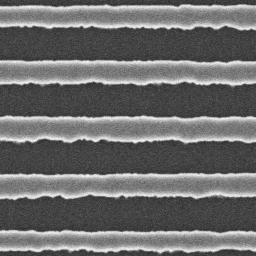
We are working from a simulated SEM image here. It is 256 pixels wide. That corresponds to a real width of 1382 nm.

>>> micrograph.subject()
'lines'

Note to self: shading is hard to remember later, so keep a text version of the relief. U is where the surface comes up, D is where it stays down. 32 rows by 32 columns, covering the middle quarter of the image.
UUUUUUUUUUUUUUUUUUUUUUUUUUUUUUUU
UUUUUUUUUUUUUUUUUUUUUUUUUUUUUUUU
UUUUUUUUUUUUUUUUUUUUUUUUUUUUUUUU
UUUUUUUUUUUUUUUUUUUUUUUUUUUUUUUU
UUUUUUDDDUUUUUUUUUUUUUUUUUUUUDDU
DDDDDDDDDDDDDDDDDDDDDDDDDDDDDDDD
DDDDDDDDDDDDDDDDDDDDDDDDDDDDDDDD
DDDDDDDDDDDDDDDDDDDDDDDDDDDDDDDD
DDDDDDDDDDDDDDDDDDDDDDDDDDDDDDDD
DDDDDDDDDDDDDDDDDDDDDDDDDDDDDDDD
DDDDDDDDDDDDDDDDDDDDDDDDDDDDDDDD
DDDDDDDDDDDDDDDDDDDDDDDDDDDDDDDD
DDDDDDDDDDDDDDDDDDDDDDDDDDDDDDDD
UUUUUUUUUUUUUUUUUUUUUUUUUUUUUDDD
UUUUUUUUUUUUUUUUUUUUUUUUUUUUUUUU
UUUUUUUUUUUUUUUUUUUUUUUUUUUUUUUU
UUUUUUUUUUUUUUUUUUUUUUUUUUUUUUUU
UUUUUUUUUUUUUUUUUUUUUUUUUUUUUUUU
UUUUUUUUUUUUUUUUUUUUUUUUUUUUUUUU
DUDDDDDDDDDDDDDDDUDDDDDDDDDDDDUU
DDDDDDDDDDDDDDDDDDDDDDDDDDDDDDDD
DDDDDDDDDDDDDDDDDDDDDDDDDDDDDDDD
DDDDDDDDDDDDDDDDDDDDDDDDDDDDDDDD
DDDDDDDDDDDDDDDDDDDDDDDDDDDDDDDD
DDDDDDDDDDDDDDDDDDDDDDDDDDDDDDDD
DDDDDDDDDDDDDDDDDDDDDDDDDDDDDDDD
DDDDDDDDDDDDDDDDDDDDDDDDDDDDDDDD
DDDDDDDDDDDDDUUUUUUDDUUUDDDDUUUU
UUUUUUUUUUUUUUUUUUUUUUUUUUUUUUUU
UUUUUUUUUUUUUUUUUUUUUUUUUUUUUUUU
UUUUUUUUUUUUUUUUUUUUUUUUUUUUUUUU
UUUUUUUUUUUUUUUUUUUUUUUUUUUUUUUU